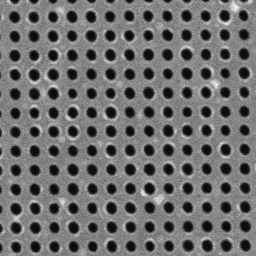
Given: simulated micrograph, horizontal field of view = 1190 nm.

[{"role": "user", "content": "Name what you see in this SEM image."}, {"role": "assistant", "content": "a regular array of holes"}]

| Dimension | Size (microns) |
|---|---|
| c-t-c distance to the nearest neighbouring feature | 0.0879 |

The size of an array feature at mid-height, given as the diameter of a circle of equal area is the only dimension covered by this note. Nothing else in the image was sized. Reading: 51.9 nm